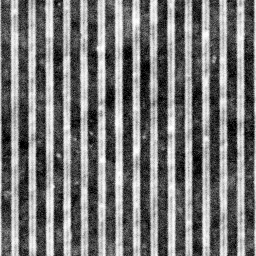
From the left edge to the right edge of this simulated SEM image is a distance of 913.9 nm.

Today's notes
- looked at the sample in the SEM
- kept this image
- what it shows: parallel lines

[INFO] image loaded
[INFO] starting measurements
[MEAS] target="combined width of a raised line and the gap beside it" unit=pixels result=17.4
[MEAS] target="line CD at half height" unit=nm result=19.6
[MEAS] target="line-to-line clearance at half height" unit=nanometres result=42.8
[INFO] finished